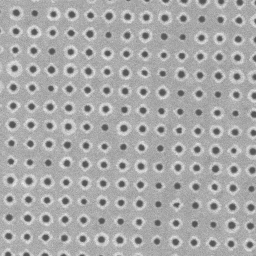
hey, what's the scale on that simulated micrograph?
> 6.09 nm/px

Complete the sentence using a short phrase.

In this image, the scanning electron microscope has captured a regular array of holes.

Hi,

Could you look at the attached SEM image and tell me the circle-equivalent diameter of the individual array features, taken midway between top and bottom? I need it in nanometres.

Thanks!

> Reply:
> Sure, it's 40.7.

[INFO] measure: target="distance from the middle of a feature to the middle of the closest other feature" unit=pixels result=18.1